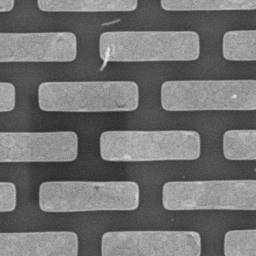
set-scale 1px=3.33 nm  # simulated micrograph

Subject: groups of lines, slits or small figures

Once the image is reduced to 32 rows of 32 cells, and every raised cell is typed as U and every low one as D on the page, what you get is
UUDDDUUUUUUUUUUUUDDDUUUUUUUUUUUU
DDDDDDDDDDDDDDDDDDDDDDDDDDDDDDDD
DDDDDDDDDDDDDDDDDDDDDDDDDDDDDDDD
DDDDDDDDDDDDDDDDDDDDDDDDDDDDDDDD
UUUUUUUUUDDDDUUUUUUUUUUUUDDDUUUU
UUUUUUUUUDDDDUUUUUUUUUUUUDDDUUUU
UUUUUUUUUDDDDUUUUUUUUUUUUDDDUUUU
UUUUUUUUUDDDDUUUUUDDDDDDDDDDDDDD
DDDDDDDDDDDDDDDDDDDDDDDDDDDDDDDD
DDDDDDDDDDDDDDDDDDDDDDDDDDDDDDDD
UDDDDUUUUUUUUUUUUDDDDUUUUUUUUUUU
UUDDDUUUUUUUUUUUUDDDUUUUUUUUUUUU
UUDDDUUUUUUUUUUUUDDDUUUUUUUUUUUU
UUDDDUUUUUUUUUUUUDDDDUUUUUUUUUUU
DDDDDDDDDDDDDDDDDDDDDDDDDDDDDDDD
DDDDDDDDDDDDDDDDDDDDDDDDDDDDDDDD
DDDDDDDDDDDDDDDDDDDDUUUUDDDDDUUU
UUUUUUUUUUDDDUUUUUUUUUUUUDDDUUUU
UUUUUUUUUUDDDUUUUUUUUUUUUDDDUUUU
UUUUUUUUUUDDDUUUUUUUUUUUUDDDUUUU
DDDDDDDDDDDDDDDDDDDDDDDDDDDDDDDD
DDDDDDDDDDDDDDDDDDDDDDDDDDDDDDDD
DDDDDDDDDDDDDDDDDDDDDDDDDDDDDDDD
UUDDDUUUUUUUUUUUUDDDUUUUUUUUUUUU
UUDDDUUUUUUUUUUUUDDDUUUUUUUUUUUU
UUDDDUUUUUUUUUUUUDDDUUUUUUUUUUUU
DDDDDDDDDDDDDDDDDDDDDDDDDDDDDDDD
DDDDDDDDDDDDDDDDDDDDDDDDDDDDDDDD
DDDDDDDDDDDDDDDDDDDDDDDDDDDDDDDD
UUUUUUUUUUDDDUUUUUUUUUUUUDDDUUUU
UUUUUUUUUUDDDUUUUUUUUUUUUDDDUUUU
UUUUUUUUUUDDDUUUUUUUUUUUUDDDUUUU